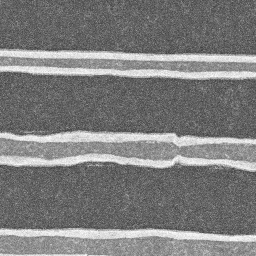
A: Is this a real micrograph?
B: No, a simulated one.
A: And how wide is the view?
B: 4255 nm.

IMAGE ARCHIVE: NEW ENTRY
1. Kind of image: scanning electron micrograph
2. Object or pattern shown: one or a few lines or trenches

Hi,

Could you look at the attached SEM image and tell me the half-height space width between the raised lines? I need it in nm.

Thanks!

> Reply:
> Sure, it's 1140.